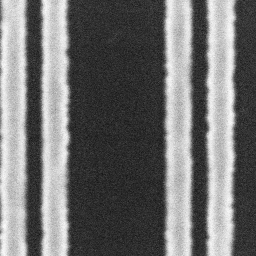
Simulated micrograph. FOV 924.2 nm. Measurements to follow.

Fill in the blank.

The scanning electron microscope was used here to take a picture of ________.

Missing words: lines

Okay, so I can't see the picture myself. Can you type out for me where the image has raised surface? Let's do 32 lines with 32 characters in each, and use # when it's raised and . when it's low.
###..###.............###..###...
###..###.............###..###...
###...##.............###..###...
###..###.............###..###...
###...##.............###..###...
###..###.............###..###...
###...##.............###..###...
###...##.............###..###...
###..###.............###..###...
###..###.............###..###...
###..###.............###..###...
###..###.............###..###...
###..###.............###..###...
###..###.............###..###...
###..###.............###..###...
###..###.............###..###...
###...##.............###..###...
###...##.............###..###...
###...##.............###..###...
###..###.............###..###...
###...##.............###..###...
###...##.............###..###...
###...##.............###..###...
###..###.............###..###...
###..###.............###..###...
###..###.............###..###...
###..###.............###..###...
###..###.............###..###...
###...##.............###..###...
###...##.............###..###...
###..###.............###..###...
###..###.............###..###...